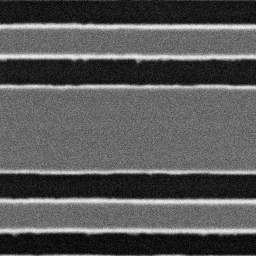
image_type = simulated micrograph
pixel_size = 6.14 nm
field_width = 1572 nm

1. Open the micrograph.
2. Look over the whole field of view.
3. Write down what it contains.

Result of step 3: lines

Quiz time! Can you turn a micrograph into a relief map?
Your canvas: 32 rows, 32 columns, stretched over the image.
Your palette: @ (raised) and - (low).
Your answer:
--------------------------------
--------------------------------
--------------------------------
@@@@@@@@@@@@@@@@@@@@@@@@@@@@@@@@
@@@@@@@@@@@@@@@@@@@@@@@@@@@@@@@@
@@@@@@@@@@@@@@@@@@@@@@@@@@@@@@@@
@@@@@@@@@@@@@@@@@@@@@@@@@@@@@@@@
--------------------------------
--------------------------------
--------------------------------
--------------------------------
@@@@@@@@@@@@@@@@@@@@@@@@@@@@@@@@
@@@@@@@@@@@@@@@@@@@@@@@@@@@@@@@@
@@@@@@@@@@@@@@@@@@@@@@@@@@@@@@@@
@@@@@@@@@@@@@@@@@@@@@@@@@@@@@@@@
@@@@@@@@@@@@@@@@@@@@@@@@@@@@@@@@
@@@@@@@@@@@@@@@@@@@@@@@@@@@@@@@@
@@@@@@@@@@@@@@@@@@@@@@@@@@@@@@@@
@@@@@@@@@@@@@@@@@@@@@@@@@@@@@@@@
@@@@@@@@@@@@@@@@@@@@@@@@@@@@@@@@
@@@@@@@@@@@@@@@@@@@@@@@@@@@@@@@@
@@@@@@@@@@@@@@@@@@@@@@@@@@@@@@@@
--------------------------------
--------------------------------
--------------------------------
@@@@@@@@@@@@@@@@@@@@@@@@@@@@@@@@
@@@@@@@@@@@@@@@@@@@@@@@@@@@@@@@@
@@@@@@@@@@@@@@@@@@@@@@@@@@@@@@@@
@@@@@@@@@@@@@@@@@@@@@@@@@@@@@@@@
--------------------------------
--------------------------------
--------------------------------